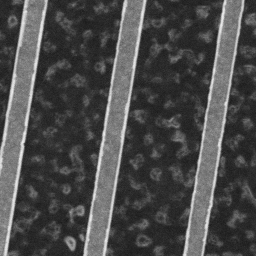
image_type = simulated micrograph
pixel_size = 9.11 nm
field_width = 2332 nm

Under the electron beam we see one or a few lines or trenches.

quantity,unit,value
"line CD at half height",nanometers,180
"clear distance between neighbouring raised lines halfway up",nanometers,709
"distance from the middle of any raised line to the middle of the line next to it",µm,0.89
